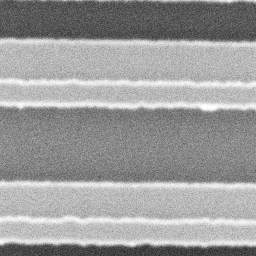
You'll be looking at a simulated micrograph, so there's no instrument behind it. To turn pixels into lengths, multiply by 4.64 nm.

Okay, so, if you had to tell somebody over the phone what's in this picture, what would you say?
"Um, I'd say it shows lines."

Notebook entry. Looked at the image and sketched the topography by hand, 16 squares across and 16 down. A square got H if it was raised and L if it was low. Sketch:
LLLLLLLLLLLLLLLL
LLLLLLLLLLLLLLLL
LLLLLLLLLLLLLLLL
HHHHHHHHHHHHHHHH
HHHHHHHHHHHHHHHH
HHHHHHHHHHHHHHHH
HHHHHHHHHHHHHHHH
LLLLLLLLLLLLLLLL
LLLLLLLLLLLLLLLL
LLLLLLLLLLLLLLLL
LLLLLLLLLLLLLLLL
HHHHHHHLLLLLLLLL
HHHHHHHHHHHHHHHH
HHHHHHHHHHHHHHHH
HHHHHHHHHHHHHHHH
LLLLLLLLLLLLLLLL